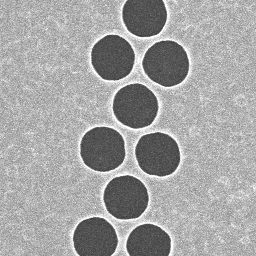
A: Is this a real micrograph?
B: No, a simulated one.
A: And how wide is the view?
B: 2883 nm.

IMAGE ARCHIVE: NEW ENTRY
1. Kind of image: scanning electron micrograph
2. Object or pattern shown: holes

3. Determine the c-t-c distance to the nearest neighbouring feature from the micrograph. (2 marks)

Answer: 600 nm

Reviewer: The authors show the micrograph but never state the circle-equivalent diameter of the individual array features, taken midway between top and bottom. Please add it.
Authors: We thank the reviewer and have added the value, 0.511 micrometres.